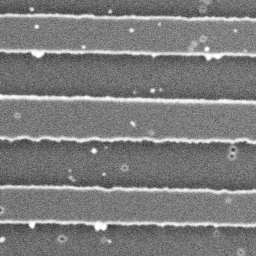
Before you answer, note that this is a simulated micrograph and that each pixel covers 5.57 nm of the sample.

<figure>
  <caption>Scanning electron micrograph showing lines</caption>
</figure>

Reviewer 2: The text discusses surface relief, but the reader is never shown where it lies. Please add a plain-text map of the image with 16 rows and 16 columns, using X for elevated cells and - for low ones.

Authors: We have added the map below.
----------------
XXXXXXXXXXXXXXXX
XXXXXXXXXXXXXXXX
----------------
----------------
----------------
XXXXXXXXXXXXXXXX
XXXXXXXXXXXXXXXX
XXXXXXXXXXXXXXXX
----------------
----------------
----------------
XXXXXXXXXXXXXXXX
XXXXXXXXXXXXXXXX
----------------
----------------